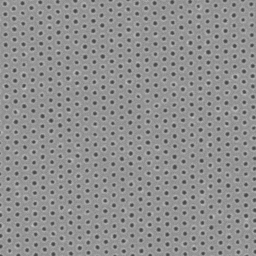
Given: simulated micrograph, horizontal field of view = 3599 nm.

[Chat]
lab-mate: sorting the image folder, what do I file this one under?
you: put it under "a regular array of holes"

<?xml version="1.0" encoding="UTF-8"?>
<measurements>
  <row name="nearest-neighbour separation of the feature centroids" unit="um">0.138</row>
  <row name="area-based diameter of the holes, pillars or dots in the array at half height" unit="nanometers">59.4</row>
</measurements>